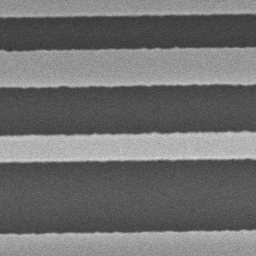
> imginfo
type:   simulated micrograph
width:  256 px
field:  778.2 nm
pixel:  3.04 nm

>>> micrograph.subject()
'lines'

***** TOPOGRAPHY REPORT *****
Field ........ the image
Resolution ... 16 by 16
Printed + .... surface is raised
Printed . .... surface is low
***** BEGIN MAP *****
++++++++++++++++
................
................
++++++++++++++++
++++++++++++++++
................
................
................
.+++++++++++++++
++++++++++++++++
................
................
................
................
..........+.++++
++++++++++++++++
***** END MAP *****